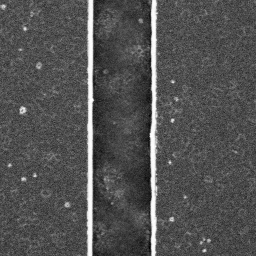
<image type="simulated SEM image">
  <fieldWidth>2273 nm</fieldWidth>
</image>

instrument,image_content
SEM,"one or a few lines or trenches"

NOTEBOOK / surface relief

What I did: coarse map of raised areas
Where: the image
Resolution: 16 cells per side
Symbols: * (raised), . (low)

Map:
******....******
******....******
******....******
******....******
******....******
******....******
******....******
******....******
******....******
******...*******
******....******
******....******
******....******
******....******
******....******
******....******